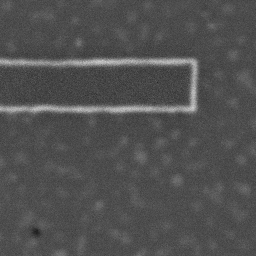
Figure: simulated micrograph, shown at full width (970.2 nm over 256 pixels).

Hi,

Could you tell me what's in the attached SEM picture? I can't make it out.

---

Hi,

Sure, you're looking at one or a few lines or trenches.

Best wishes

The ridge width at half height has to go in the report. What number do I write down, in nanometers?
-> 182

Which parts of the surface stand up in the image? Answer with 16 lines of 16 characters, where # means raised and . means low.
................
................
................
................
############....
############....
############....
................
................
................
................
................
................
................
................
................